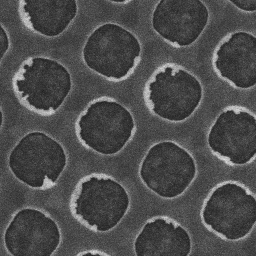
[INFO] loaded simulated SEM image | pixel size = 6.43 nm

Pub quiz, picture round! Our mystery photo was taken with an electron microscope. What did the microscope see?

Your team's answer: holes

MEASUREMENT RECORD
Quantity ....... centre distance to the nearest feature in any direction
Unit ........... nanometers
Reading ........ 474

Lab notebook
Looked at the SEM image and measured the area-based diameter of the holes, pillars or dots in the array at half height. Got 340 nanometres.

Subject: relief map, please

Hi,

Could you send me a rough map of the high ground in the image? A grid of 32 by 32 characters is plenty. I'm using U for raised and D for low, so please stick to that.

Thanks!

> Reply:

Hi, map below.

UUUDDDDDDDUUUUUUUUUUDDDDDUUUUDDD
UUUDDDDDDDUUUUUUUUUDDDDDDDUUUUUU
UUUUDDDDDUUUUUUUUUUDDDDDDDUUUUUU
UUUUDDDDUUUUDDDUUUUDDDDDDUUUUUUU
DUUUUUDUUUUDDDDDDUUUDDDDDUUUUDDD
DUUUUUUUUUUDDDDDDUUUUUDDUUUUDDDD
DUUUUUUUUUDDDDDDDDUUUUUUUUUDDDDD
UUUUDDDUUUUDDDDDDUUUUUUUUUUDDDDD
UUUDDDDDUUUDDDDDUUUUUUUUUUUDDDDD
UUUDDDDDDUUUUDDUUUUUDDDDUUUUDDDD
UUDDDDDDDUUUUUUUUUUDDDDDDUUUUDDD
UUUDDDDDDUUUUUUUUUUDDDDDDUUUUUUU
UUUDDDDDUUUUUUUUUUUDDDDDDUUUUUUU
UUUUUDDUUUUDDDDDUUUDDDDDUUUUUUUU
UUUUUUUUUUDDDDDDUUUUDDDDUUUDDDDU
UUUUUUUUUUDDDDDDDUUUUUUUUUUDDDDD
UUUUUUUUUUDDDDDDUUUUUUUUUUDDDDDD
UUUDDDDUUUDDDDDDUUUUUUUUUUDDDDDD
UUDDDDDDUUUDDDDUUUUDDDDUUUDDDDDD
UDDDDDDDUUUUUUUUUUDDDDDDUUUUDDDD
UDDDDDDDUUUUUUUUUUDDDDDDUUUUUUUU
UUDDDDDDUUUUUUUUUDDDDDDDDUUUUUUU
UUUDDDDUUUUDDDUUUUDDDDDDUUUUUUUU
UUUUUUUUUUDDDDDUUUUDDDDUUUUDDDUU
UUUUUUUUUUDDDDDDUUUUDDUUUUDDDDDU
UUUUUUUUUUDDDDDDUUUUUUUUUUDDDDDD
UUDDDUUUUUDDDDDDUUUUUUUUUDDDDDDD
UUDDDDDUUUUDDDDUUUUUUUUUUUDDDDDD
UDDDDDDUUUUUDDUUUUDDDDDUUUUDDDDU
UDDDDDDDUUUUUUUUUDDDDDDDUUUUDDDU
UDDDDDDUUUUUUUUUUDDDDDDDUUUUUUUU
UDDDDDDUUUUUUUUUUDDDDDDDUUUUUUUU